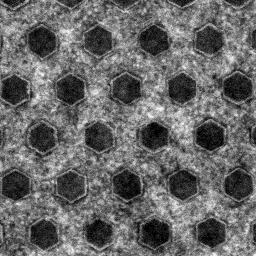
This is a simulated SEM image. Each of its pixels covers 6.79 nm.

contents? a regular array of raised bodies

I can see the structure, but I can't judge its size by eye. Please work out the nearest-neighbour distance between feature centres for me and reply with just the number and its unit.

374 nm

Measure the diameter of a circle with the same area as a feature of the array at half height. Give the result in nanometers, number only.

210